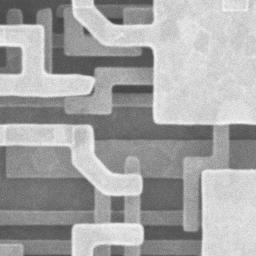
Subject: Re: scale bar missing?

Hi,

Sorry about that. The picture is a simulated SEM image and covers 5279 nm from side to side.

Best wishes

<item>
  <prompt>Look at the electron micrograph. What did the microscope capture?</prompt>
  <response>wiring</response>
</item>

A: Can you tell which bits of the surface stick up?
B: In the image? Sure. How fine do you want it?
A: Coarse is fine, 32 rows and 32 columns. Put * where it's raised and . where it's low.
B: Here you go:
.........***.......*************
.**..*..****...*****************
.**..*..*****..*****************
******..************************
******..************************
******..************************
.*****..**********.*************
.*****.............*************
******......*****..*************
**********..********************
********************************
***********.**.....*************
........******.....*************
........******.....*************
...................*************
.......................*.****...
************...............*....
************...............*....
.........***...............*....
.........***..............**....
.........****...*......*****....
..........****.**......*********
...........*******.....*********
............******.....*********
............**.***.....*********
............**..*......*********
............**..*......*********
............**..*......*********
.........*********.....*********
.........*********.......*******
.........*****.***.......*******
***......*****..*........*******